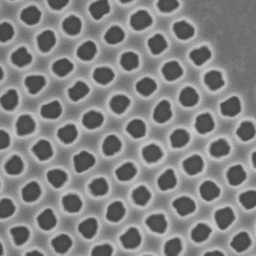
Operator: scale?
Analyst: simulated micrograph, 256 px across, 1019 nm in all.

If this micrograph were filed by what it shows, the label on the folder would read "a regular array of holes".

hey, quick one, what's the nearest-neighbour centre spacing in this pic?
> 118 nm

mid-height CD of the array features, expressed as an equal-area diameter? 81.2 nanometers